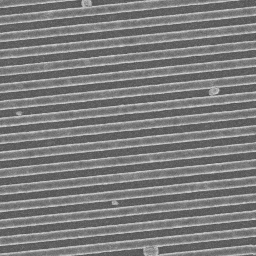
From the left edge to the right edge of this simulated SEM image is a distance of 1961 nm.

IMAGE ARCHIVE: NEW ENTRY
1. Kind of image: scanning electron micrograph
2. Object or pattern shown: parallel lines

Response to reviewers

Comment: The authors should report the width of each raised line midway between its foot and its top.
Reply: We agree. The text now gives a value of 60.9 nanometers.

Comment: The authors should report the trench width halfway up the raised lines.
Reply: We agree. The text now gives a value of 0.0676 µm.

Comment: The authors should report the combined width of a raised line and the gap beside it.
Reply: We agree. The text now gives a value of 0.13 micrometres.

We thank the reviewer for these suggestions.